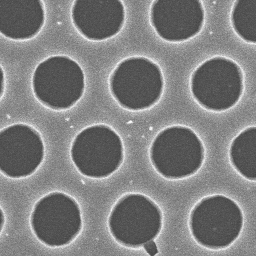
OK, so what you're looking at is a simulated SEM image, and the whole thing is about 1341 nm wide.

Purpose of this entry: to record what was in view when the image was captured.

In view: holes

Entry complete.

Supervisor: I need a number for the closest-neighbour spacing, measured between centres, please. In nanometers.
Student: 415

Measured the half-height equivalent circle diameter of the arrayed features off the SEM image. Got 272 nm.